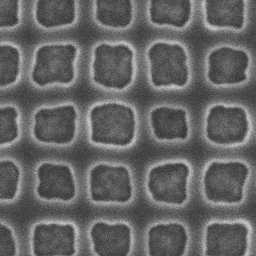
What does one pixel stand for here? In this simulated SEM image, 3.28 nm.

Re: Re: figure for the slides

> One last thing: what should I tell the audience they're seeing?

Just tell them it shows a regular array of holes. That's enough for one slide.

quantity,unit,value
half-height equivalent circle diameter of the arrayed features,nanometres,139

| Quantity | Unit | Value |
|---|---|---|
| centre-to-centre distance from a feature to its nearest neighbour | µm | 0.185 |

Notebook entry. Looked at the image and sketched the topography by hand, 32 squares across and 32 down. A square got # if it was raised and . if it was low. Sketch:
..###....###....###.....##.....#
..##.....###.....##.....##....##
..###....###....###.....##....##
#############################.##
################################
###################..###########
..###.....##.....##....####....#
..##.....###.....##....###.....#
..##.....###.....##....###.....#
..##.....###.....##.....##.....#
.####.#######...###....####..###
################################
################################
..#####..###....####..####....##
..##......#......##....###.....#
..##.....##......##....###.....#
..##.....##......##.....##.....#
..###....##......#########.....#
################################
################################
..###################..###....##
..###....##.....###.....##.....#
..###....##.....###....###.....#
..###....##.....###....###....##
..###....##.....###....###....##
######################.#########
################################
################################
.###.....###....###....###.....#
.###.....##.....###....###.....#
..##.....###....###....###.....#
..##.....###....###....###.....#